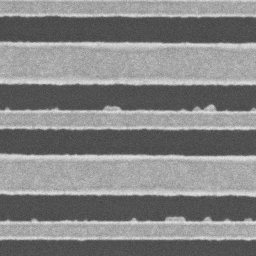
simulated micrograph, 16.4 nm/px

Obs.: lines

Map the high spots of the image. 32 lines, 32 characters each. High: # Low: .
################################
################################
................................
................................
................................
#############.........##........
################################
################################
################################
################################
...........................##...
................................
................................
................................
################################
################################
................................
................................
................................
................................
################################
################################
################################
################################
................................
................................
................................
................................
################################
################################
................................
................................